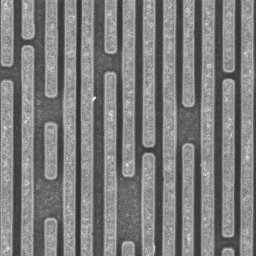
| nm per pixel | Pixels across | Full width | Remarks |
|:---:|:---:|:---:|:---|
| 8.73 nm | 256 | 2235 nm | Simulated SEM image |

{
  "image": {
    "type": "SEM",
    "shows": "parallel lines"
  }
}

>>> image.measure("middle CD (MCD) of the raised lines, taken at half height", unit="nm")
114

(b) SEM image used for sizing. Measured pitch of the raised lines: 174 nanometres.